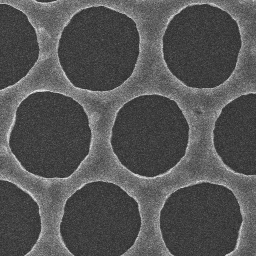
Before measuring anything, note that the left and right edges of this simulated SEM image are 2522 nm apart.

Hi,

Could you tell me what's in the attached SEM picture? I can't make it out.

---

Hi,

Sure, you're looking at holes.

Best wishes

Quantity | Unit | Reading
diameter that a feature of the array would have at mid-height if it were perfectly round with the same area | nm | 819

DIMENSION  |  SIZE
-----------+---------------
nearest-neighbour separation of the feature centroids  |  976 nm